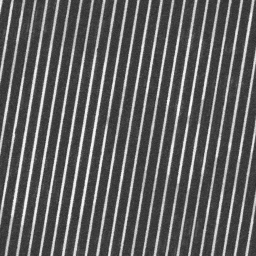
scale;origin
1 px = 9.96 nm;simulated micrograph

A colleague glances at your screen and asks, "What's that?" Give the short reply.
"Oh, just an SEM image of parallel lines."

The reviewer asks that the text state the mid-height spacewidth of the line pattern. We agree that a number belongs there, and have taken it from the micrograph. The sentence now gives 93.5 nm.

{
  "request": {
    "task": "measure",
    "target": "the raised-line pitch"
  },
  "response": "113 nm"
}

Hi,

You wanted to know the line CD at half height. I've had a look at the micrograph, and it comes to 17.2 nm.